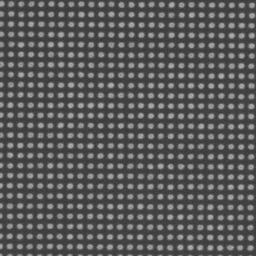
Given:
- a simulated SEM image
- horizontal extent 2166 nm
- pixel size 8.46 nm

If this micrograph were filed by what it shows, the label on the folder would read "a regular array of raised bodies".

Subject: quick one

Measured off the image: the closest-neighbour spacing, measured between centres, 81 nanometers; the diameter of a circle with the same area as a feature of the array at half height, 43.8 nanometers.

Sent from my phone